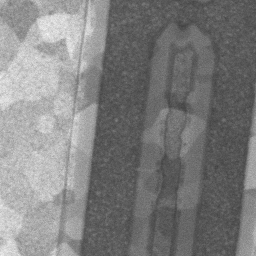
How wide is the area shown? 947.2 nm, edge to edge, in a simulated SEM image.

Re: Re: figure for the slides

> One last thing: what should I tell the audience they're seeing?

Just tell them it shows one or a few lines or trenches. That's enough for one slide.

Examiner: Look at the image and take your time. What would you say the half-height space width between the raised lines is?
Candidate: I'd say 0.254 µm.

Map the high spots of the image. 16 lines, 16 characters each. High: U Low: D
UUUUUUDDDDDDDDDD
UUUUUUDDDDDDDDDD
UUUUUUDDDDUUDDDD
UUUUUUDDDDUUUDDD
UUUUUUDDDDUUUDDD
UUUUUUDDDDUUUDDD
UUUUUDDDDDUUUDDD
UUUUUDDDDDUUDDDD
UUUUUDDDDUUUDDDD
UUUUUDDDDUUUDDDD
UUUUUDDDDUUUDDDD
UUUUUDDDDUUUDDDD
UUUUUDDDDUUUDDDD
UUUUUDDDDUUUDDDD
UUUUUDDDDUUUDDDD
UUUUDDDDDUUDDDDD